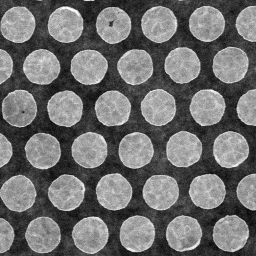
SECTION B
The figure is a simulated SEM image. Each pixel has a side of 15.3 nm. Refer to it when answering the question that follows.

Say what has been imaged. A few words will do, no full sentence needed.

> a regular array of raised bodies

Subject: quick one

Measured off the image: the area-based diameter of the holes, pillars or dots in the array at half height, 543 nanometres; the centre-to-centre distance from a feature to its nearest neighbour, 716 nanometres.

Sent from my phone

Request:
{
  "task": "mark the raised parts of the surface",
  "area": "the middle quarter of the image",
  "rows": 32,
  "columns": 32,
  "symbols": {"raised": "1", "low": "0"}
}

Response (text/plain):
00111111111001111111110001111111
00111111111000111111110001111111
00111111110000111111110000111111
00011111010000011111100000011111
00001111000000001111000000001110
00000000000000000000000000000000
00000000000000000000000110000000
11100000001111000000011111000000
11110000011111110000111111100000
11110000111111110000111101110000
11111000111111111001111100110000
11110000111111110001111110110000
11110000111111110000111111010000
11110000011111010000111111100000
11100000011110000000011111000000
11000000000000000000000000000000
00000000000000000000000000000000
00000111000000001111000000001111
00011111110000011111100000011111
00111111110000111111110000111111
00111111111000111111110000111111
00101111111000111111110000111111
00110111111000111111110000111111
00010111110000111111110000111111
00011011110000011111100000011111
00000111000000001111000000001110
00000000000000000000000000000000
00000000000001000000000000000000
11100000001011100000001111100000
11110000011111110000011111110000
11110000111111111000111111110000
11100000111111111000111111110001